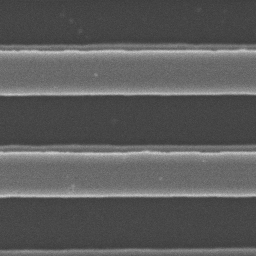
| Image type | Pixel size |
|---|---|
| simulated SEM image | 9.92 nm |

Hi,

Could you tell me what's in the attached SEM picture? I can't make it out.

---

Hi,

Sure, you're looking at lines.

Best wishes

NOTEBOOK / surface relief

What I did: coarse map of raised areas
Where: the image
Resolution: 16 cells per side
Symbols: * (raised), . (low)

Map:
................
................
................
****************
****************
****************
................
................
................
****************
****************
****************
................
................
................
................